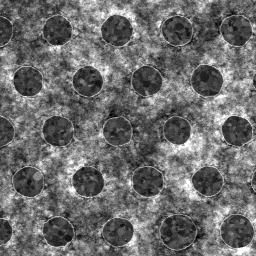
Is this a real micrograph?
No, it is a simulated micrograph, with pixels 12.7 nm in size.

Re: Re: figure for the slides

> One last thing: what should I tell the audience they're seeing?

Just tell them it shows a regular array of raised bodies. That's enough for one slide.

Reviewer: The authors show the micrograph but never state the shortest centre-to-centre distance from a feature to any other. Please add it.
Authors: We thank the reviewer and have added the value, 740 nanometers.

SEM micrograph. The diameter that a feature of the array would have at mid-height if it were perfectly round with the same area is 31.5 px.